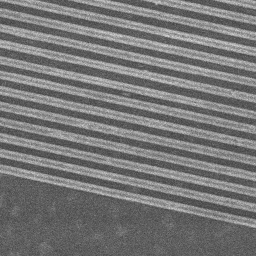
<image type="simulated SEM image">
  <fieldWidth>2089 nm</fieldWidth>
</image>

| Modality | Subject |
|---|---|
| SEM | parallel lines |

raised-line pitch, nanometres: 125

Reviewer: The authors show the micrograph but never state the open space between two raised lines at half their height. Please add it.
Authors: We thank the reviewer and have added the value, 9.53 pixels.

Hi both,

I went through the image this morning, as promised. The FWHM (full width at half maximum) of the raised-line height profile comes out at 46.9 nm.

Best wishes